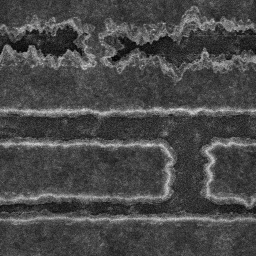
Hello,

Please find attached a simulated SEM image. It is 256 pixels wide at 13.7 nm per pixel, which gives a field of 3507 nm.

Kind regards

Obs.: one or a few lines or trenches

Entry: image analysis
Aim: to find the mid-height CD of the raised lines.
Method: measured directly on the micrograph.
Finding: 728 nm